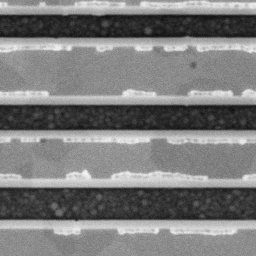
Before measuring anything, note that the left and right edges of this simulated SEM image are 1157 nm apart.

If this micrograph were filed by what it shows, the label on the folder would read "one or a few lines or trenches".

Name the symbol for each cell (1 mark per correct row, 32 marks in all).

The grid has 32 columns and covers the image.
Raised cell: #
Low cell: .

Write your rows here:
################################
................................
................................
................................
................................
################################
################################
################################
################################
################################
################################
################################
.......................#........
................................
................................
................................
................................
################################
################################
################################
################################
################################
################################
................................
................................
................................
................................
................................
################################
################################
################################
################################